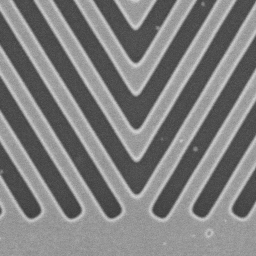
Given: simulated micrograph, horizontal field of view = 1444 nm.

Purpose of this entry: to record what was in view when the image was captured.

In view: groups of lines, slits or small figures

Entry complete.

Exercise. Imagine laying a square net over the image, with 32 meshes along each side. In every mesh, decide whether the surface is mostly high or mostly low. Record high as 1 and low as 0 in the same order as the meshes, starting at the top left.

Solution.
11000110001100011110001100011000
11000110001100011110011100111001
01100011000110001100011000110001
01110011100111000000110001100011
00110001100011000000110001100011
00011000110001100001100011000110
00011000111001110011100111001110
10001100011000110011000110001100
11001110011100011110001100011000
11000110001100011110011100111001
01100011000110001100011000110001
01110011100111001000111001110011
00110001100011000000110001100011
00011000110001100001100011000110
00011000110001110001100011000110
10001100011000110011000110001100
11001110011100111111001110011100
11000110001100011110001100011000
01100011000110001100011000110001
01110011100111001100111000110011
00110001100011000000110001100011
00111000110001100001110011100111
00011000110001100001100011000110
10001100011000110011000110001100
11001110011100111111001110011100
11000110001100011110001100011000
11100111001110011110011100111001
11111111111111111111111111111111
11111111111111111111111111111111
11111111111111111111111111111111
11111111111111111111111111111111
11111111111111111111111111111111